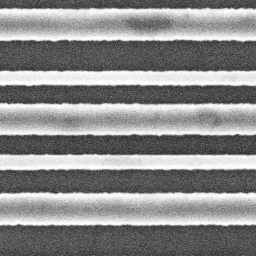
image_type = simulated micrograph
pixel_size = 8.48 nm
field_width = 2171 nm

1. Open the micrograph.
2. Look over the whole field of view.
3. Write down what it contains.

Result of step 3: lines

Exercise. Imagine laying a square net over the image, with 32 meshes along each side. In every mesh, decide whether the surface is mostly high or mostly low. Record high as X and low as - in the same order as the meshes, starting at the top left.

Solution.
--------------------------------
XXXXXXXXXXXXXXXXXXXXXXXXXXXXXXXX
XXXXXXXXXXXXXXXXXXXXXXXXXXXXXXXX
XXXXXXXXXXXXXXXXXXXXXXXXXXXXXXXX
XXXXXXXXXXXXXXXXXXXXXXXXXXXXXXXX
--------------------------------
--------------------------------
--------------------------------
--------------------------------
XXXXXXXXXXXXXXXXXXXXXXXXXXXXXXXX
XXXXX-XXXXXXXXXX-XXXXXXXXXXXXXXX
--------------------------------
--------------------------------
XXXXXXXXXXXXXXXXXXXXXXXXXXXXXXXX
XXXXXXXXXXXXXXXXXXXXXXXXXXXXXXXX
XXXXXXXXXXXXXXXXXXXXXXXXXXXXXXXX
XXXXXXXXXXXXXXXXXXXXXXXXXXXXXXXX
--------------------------------
--------------------------------
XXXXXXXXXXXXXXXXXXXXXXXXXXXXXXXX
XXXXXXXXXXXXXXXXXXXXXXXXXXXXXXXX
--------------------------------
--------------------------------
--------------------------------
XXXXXXXXXXXXXXXXXXXXXXXXXXXXXXXX
XXXXXXXXXXXXXXXXXXXXXXXXXXXXXXXX
XXXXXXXXXXXXXXXXXXXXXXXXXXXXXXXX
XXXXXXXXXXXXXXXXXXXXXXXXXXXXXXXX
--------------------------------
--------------------------------
--------------------------------
--------------------------------